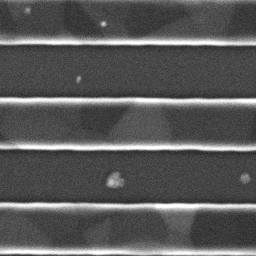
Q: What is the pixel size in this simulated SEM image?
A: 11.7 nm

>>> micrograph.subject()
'wiring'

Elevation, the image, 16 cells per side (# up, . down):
################
################
################
................
................
................
################
################
################
................
................
................
................
################
################
################